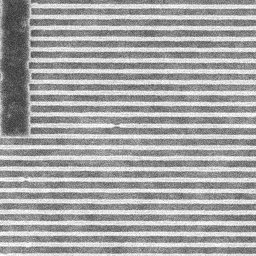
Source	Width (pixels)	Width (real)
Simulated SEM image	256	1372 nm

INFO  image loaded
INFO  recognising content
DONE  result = parallel lines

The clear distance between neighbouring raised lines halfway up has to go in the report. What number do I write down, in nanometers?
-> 42.2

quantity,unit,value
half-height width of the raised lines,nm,16.1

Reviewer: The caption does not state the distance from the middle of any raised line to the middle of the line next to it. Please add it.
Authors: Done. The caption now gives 58 nm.